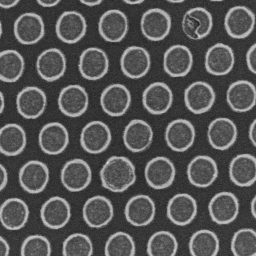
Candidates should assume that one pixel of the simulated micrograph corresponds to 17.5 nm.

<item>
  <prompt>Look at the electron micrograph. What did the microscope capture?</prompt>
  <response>a regular array of raised bodies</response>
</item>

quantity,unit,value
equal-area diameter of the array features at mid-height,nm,499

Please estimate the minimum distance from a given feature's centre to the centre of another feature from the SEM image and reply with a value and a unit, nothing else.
733 nm